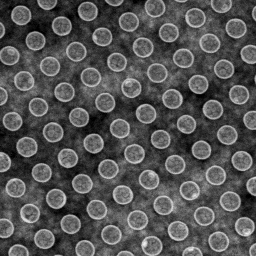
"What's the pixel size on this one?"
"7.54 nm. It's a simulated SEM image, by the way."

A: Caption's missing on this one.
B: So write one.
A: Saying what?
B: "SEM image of a regular array of raised bodies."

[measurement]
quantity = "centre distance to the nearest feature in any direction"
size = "221 nanometers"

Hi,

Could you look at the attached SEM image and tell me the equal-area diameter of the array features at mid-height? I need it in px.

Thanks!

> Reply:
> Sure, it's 19.1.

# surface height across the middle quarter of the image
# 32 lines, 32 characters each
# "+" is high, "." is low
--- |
...........++.+.......+++....++.
.....+++....+++......+++++......
....+++++............+++++......
....+++++............+++++......
.....++++......++++....+.......+
++....++......+++++............+
+++...........+++++.......++....
++.......++....++++......++++...
++......++++.............+++....
........+++++............++++...
........+++++......+++...++++...
..+++....+++......+++++.........
..++++............+++++.........
.+++++............+++++......+++
..++++......++++....++......++++
...++.......++++............++++
............++++.............+++
............++++......++++......
.....++++.............++++......
.....+++++............++++......
.....+++++......+++....+++......
++....+++......+++++............
+++............++.++............
+++............+++++......+++...
+++.......+++....++......+++++..
++.......++++............+++++..
.........++++.............++++..
.........++++......++++.........
...++++...++.......+++++........
..+++++............+++++.......+
..+++++.......+.....+++......+++
...++++.....+++++............+++